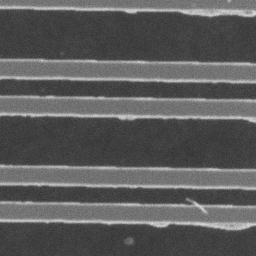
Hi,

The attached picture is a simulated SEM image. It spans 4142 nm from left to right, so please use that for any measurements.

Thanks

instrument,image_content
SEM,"lines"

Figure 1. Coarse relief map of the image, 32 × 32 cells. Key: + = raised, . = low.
++++++++++++++++++++++++++++++++
.......................+++++.+++
................................
................................
................................
................................
................................
++++++..........................
++++++++++++++++++++++++++++++++
++++++++++++++++++++++++++++++++
................................
................................
++++++++++++++++++++++++++......
++++++++++++++++++++++++++++++++
..........++++++++++++++++++++++
................................
................................
................................
................................
................................
................................
++++++++++++++++++++++++++++++++
++++++++++++++++++++++++++++++++
........................++++++++
................................
++++++++++......................
++++++++++++++++++++++++++++++++
++++++++++++++++++++++++++++++++
............................+++.
................................
................................
................................